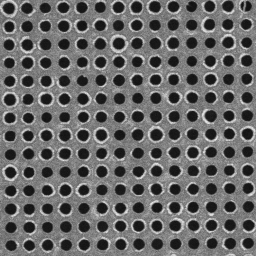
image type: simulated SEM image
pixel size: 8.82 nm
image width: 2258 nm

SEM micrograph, a regular array of holes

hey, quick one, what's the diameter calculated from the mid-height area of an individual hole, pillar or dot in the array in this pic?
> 0.0975 micrometres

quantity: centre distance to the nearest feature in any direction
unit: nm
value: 158